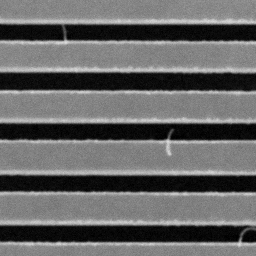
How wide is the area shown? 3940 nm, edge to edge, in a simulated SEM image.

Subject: lines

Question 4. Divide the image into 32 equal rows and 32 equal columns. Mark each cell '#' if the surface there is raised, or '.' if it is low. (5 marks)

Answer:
################################
################################
################################
................................
................................
################################
################################
################################
################################
................................
................................
################################
################################
################################
################################
................................
................................
..#####...###.......##..........
################################
################################
################################
################################
................................
................................
################################
################################
################################
################################
................................
................................
################################
################################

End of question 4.